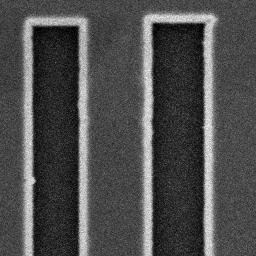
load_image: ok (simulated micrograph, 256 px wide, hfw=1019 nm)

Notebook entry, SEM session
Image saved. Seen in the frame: one or a few lines or trenches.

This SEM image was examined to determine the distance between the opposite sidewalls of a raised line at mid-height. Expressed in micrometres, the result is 0.26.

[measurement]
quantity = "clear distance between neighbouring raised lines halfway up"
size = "237 nanometers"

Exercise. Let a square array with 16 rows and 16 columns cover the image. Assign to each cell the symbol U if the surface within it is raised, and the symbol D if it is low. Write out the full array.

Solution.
UUUUUUUUUUUUUUUU
UUDDDUUUUDDDDUUU
UUDDDUUUUDDDDUUU
UUDDDUUUUDDDDUUU
UUDDDUUUUDDDDUUU
UUDDDUUUUDDDDUUU
UUDDDUUUUDDDDUUU
UUDDDUUUUDDDDUUU
UUDDDUUUUDDDDUUU
UUDDDUUUUDDDDUUU
UUDDDUUUUDDDDUUU
UUDDDUUUUDDDDUUU
UUDDDUUUUDDDDUUU
UUDDDUUUUDDDDUUU
UUDDDUUUUDDDDUUU
UUDDDUUUUDDDDUUU